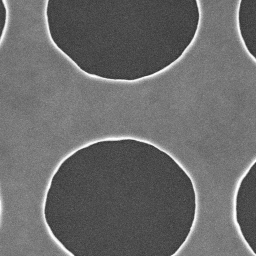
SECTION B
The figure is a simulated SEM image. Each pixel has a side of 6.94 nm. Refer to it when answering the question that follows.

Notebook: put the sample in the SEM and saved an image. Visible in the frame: holes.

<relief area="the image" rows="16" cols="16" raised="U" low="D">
UUUDDDDDDDDDUUUD
UUUDDDDDDDDDUUUD
UUUDDDDDDDDDUUUD
UUUUDDDDDDDUUUUU
UUUUUDDDDDUUUUUU
UUUUUUUUUUUUUUUU
UUUUUUUUUUUUUUUU
UUUUUUUUUUUUUUUU
UUUUUUUUUUUUUUUU
UUUUUDDDDDUUUUUU
UUUUDDDDDDDUUUUU
UUUDDDDDDDDDUUUD
UUUDDDDDDDDDUUUD
UUUDDDDDDDDDUUUD
UUUDDDDDDDDDUUUD
UUUUDDDDDDDUUUUU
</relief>